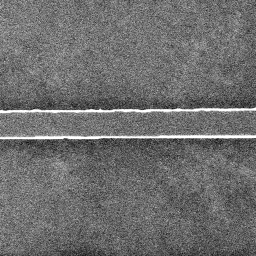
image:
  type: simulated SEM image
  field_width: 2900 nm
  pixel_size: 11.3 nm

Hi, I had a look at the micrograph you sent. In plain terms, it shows lines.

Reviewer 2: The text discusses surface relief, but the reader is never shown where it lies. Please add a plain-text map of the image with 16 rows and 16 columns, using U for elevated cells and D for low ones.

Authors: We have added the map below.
DDDDDDDDDDDDDDDD
DDDDDDDDDDDDDDDD
DDDDDDDDDDDDDDDD
DDDDDDDDDDDDDDDD
DDDDDDDDDDDDDDDD
DDDDDDDDDDDDDDDD
DDDDDDDDDDDDDDDD
UUUUUUUUUUUUUUUU
UUUUUUUUUUUUUUUU
DDDDDDDDDDDDDDDD
DDDDDDDDDDDDDDDD
DDDDDDDDDDDDDDDD
DDDDDDDDDDDDDDDD
DDDDDDDDDDDDDDDD
DDDDDDDDDDDDDDDD
DDDDDDDDDDDDDDDD